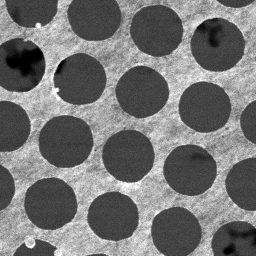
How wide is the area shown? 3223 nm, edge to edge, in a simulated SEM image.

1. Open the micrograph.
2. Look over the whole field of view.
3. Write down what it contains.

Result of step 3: a regular array of holes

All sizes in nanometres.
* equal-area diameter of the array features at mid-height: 672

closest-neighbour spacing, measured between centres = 63.2 px